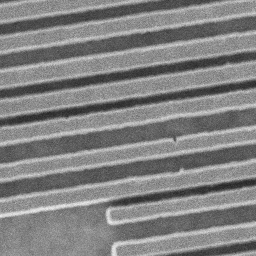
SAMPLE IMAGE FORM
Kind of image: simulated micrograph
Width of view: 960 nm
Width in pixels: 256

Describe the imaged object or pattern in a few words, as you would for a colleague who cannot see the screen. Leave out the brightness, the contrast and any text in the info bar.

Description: parallel lines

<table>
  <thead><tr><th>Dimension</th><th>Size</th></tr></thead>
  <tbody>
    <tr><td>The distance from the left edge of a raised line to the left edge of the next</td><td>31.8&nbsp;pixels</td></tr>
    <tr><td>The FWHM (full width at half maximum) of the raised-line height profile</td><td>63.5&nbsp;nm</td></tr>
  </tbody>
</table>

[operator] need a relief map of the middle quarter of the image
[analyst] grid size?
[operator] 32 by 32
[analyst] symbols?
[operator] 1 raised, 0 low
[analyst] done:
11111111111111111111100000000000
11111111111111000000000000000000
11111111000000000000000000011111
11000000000000000000111111111111
00000000000000111111111111111111
00000001111111111111111111111111
11111111111111111111111111111100
11111111111111111111111100000000
11111111111111111000000000000000
11111111111000000000000000111111
11110000000000000001111111111111
00000000000001111111111111111111
00000011111111111111111111111111
01111111111111111111111111000000
11111111111111111111100000000000
11111111111111100000000000000000
11111111100000000000000000000000
00000000000000000000000000000000
00000000000000000000000000000111
00000000000000000000000111111111
00000000000000001111111111111111
00000000001111111111111111111111
00011111111111111111111111111000
11111111111111111111110000000000
11111111111111010000000000000000
11111111100000000000000000000000
10000000000000000000000000000000
00000000000000000000000000101111
00000000000000000011111111111111
00000000000001111111111111111111
00000111111111111111111111111111
11111111111111111111111111100000